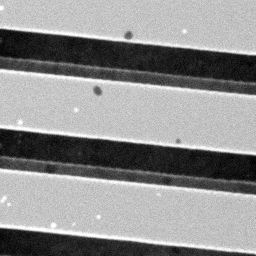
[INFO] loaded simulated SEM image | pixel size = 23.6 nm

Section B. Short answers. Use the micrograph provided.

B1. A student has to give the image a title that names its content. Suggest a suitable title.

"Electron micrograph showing lines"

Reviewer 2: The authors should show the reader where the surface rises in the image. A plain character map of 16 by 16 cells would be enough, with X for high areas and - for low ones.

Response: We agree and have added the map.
XXXXXXXXXXXXXXXX
XXXXXXXXXXXXXXXX
-------XXXXXXXXX
----------------
XX--------------
XXXXXXXXXXX-----
XXXXXXXXXXXXXXXX
XXXXXXXXXXXXXXXX
-----XXXXXXXXXXX
--------------XX
----------------
XXXXXXXXX-------
XXXXXXXXXXXXXXXX
XXXXXXXXXXXXXXXX
---XXXXXXXXXXXXX
-------------XXX